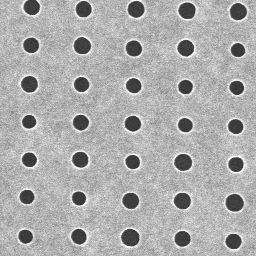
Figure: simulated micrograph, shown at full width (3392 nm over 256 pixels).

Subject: a regular array of holes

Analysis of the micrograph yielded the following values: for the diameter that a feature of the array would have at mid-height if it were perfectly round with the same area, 0.208 µm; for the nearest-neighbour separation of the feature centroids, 0.499 microns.